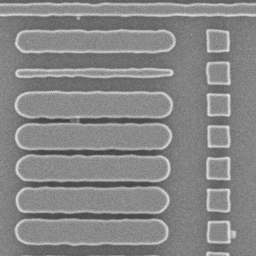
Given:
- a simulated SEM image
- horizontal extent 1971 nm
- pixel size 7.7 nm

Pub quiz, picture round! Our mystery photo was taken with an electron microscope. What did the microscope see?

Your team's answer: groups of lines, slits or small figures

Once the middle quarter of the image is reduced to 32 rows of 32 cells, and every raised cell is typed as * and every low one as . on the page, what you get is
................................
***************************.....
***************************.....
................................
................................
................................
................................
*************************.......
**************************......
***************************.....
***************************.....
***************************.....
**************************......
**..............................
................................
**************************......
**************************......
***************************.....
***************************.....
**************************......
**************************......
................................
................................
*************************.......
**************************......
**************************......
**************************......
**************************......
*************************.......
................................
................................
*************************.......